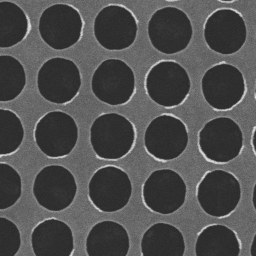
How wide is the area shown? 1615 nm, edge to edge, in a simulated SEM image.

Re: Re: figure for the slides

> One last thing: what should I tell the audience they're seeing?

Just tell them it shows a regular array of holes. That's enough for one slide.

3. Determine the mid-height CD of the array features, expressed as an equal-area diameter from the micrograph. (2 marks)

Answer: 278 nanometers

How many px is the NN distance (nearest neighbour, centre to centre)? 53.7